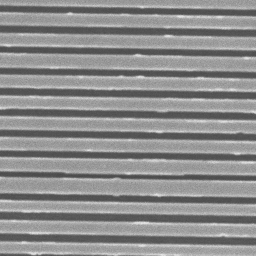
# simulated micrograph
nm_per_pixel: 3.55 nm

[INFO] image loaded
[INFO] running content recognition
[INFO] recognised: parallel lines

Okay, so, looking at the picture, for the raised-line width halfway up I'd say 50.2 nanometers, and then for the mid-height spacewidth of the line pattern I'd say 23.5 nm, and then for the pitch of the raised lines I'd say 73.9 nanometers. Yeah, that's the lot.